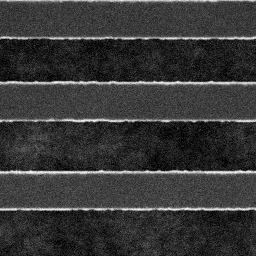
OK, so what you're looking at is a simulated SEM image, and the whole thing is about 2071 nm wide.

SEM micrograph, lines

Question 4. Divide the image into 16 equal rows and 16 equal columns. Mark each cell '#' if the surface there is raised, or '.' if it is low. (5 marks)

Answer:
################
################
................
................
................
################
################
################
................
................
................
################
################
................
................
................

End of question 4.